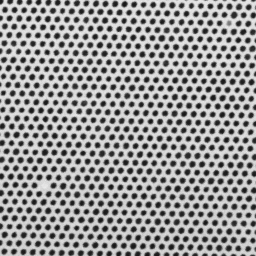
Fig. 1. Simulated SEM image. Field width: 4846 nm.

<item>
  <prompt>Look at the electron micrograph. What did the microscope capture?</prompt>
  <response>a regular array of holes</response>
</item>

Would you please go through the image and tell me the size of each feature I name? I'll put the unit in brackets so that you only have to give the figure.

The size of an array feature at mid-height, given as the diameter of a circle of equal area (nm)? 121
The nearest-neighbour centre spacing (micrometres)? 0.176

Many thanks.